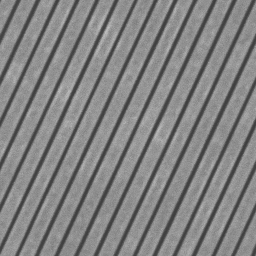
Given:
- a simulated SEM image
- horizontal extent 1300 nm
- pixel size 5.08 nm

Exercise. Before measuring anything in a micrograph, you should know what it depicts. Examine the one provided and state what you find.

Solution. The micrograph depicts parallel lines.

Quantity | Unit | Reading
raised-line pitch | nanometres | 90.5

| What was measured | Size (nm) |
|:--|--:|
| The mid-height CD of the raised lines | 70.8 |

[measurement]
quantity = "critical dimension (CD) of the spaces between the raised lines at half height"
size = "20.1 nanometres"